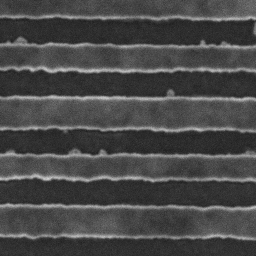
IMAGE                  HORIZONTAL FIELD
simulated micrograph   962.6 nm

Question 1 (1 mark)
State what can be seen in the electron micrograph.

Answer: lines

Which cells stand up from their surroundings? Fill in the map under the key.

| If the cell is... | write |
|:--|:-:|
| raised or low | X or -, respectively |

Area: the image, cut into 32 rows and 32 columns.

XXXXXXXXXXXXXXXXXXXXXXXXXXXXXXXX
XXXXXXXXXXXXXXXXXXXXXXXXXXXXXXXX
--------------------------XXX---
--------------------------------
--------------------------------
XXXXX-XXX-XX-X------------------
XXXXXXXXXXXXXXXXXXXXXXXXXXXXXXXX
XXXXXXXXXXXXXXXXXXXXXXXXXXXXXXXX
XXXXXXXXXXXXXXXXXXXXXXXXXXXXXXXX
--------------------------------
--------------------------------
--------------------------------
XXXXXXXXXXXXXXXXXXXXXXXXXXXXXXXX
XXXXXXXXXXXXXXXXXXXXXXXXXXXXXXXX
XXXXXXXXXXXXXXXXXXXXXXXXXXXXXXXX
XXXXXXXXXXXXXXXXXXXXXXXXXXXXXXXX
--------------------------------
--------------------------------
--------------------------------
XXXXXXXXXXXXXXXXXXXXXXXXXXXXXXXX
XXXXXXXXXXXXXXXXXXXXXXXXXXXXXXXX
XXXXXXXXXXXXXXXXXXXXXXXXXXXXXXXX
X--------XXX------XXX--XXX-XXXXX
--------------------------------
--------------------------------
--------------------------------
XXXXXXXXXXXXXXXXXXXXXXXXXXXXXXXX
XXXXXXXXXXXXXXXXXXXXXXXXXXXXXXXX
XXXXXXXXXXXXXXXXXXXXXXXXXXXXXXXX
XXXXXXXXXXXXXXXXXXXXXXXXXXXXXXXX
--------------------------------
--------------------------------